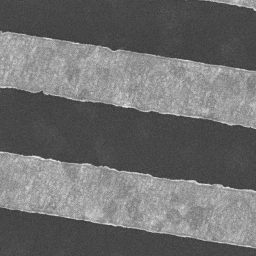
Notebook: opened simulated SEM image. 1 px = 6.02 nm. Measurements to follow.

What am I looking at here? one or a few lines or trenches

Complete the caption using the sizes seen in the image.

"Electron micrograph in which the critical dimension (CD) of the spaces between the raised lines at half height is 381 nm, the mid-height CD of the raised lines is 333 nanometers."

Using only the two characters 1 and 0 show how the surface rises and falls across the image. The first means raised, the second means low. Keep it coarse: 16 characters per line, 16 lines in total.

0000000000000000
0000000000000000
1111000000000000
1111111111000000
1111111111111111
0111111111111111
0000000111111111
0000000000000111
0000000000000000
0000000000000000
1111111000000000
1111111111111000
1111111111111111
0000111111111111
0000000000111111
0000000000000000